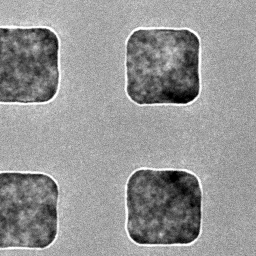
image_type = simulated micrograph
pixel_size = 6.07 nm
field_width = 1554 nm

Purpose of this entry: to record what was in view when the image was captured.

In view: holes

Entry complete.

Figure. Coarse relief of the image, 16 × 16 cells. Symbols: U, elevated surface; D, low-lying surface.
UUUUUUUUUUUUUUUU
UUUUUUUUUUUUUUUU
DDDDUUUUDDDDUUUU
DDDDUUUUDDDDUUUU
DDDDUUUUDDDDUUUU
DDDDUUUUDDDDUUUU
UUUUUUUUUDDDUUUU
UUUUUUUUUUUUUUUU
UUUUUUUUUUUUUUUU
UUUUUUUUUUUUUUUU
UUUUUUUUUUUUUUUU
DDDUUUUUDDDDUUUU
DDDDUUUUDDDDDUUU
DDDDUUUUDDDDDUUU
DDDDUUUUDDDDUUUU
DDDUUUUUUUUUUUUU